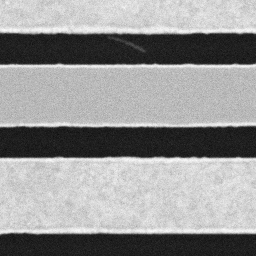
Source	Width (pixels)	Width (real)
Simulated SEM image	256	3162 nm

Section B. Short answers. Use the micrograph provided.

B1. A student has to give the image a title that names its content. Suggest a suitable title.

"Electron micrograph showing lines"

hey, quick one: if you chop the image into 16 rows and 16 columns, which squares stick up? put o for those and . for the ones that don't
oooooooooooooooo
oooooooooooooooo
................
................
oooooooooooooooo
oooooooooooooooo
oooooooooooooooo
oooooooooooooooo
................
................
oooooooooooooooo
oooooooooooooooo
oooooooooooooooo
oooooooooooooooo
oooooooooooooooo
................